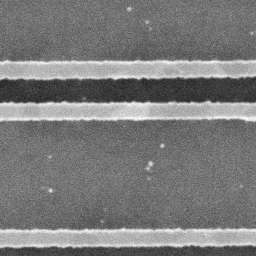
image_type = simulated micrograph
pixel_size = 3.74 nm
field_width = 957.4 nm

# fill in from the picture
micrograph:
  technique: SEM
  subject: lines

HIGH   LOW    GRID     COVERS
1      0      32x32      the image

00000000000000000000000000000000
00000000000000000000000000000000
00000000000000000000000000000000
00000000000000000000000000000000
00000000000000000000000000000000
00000000000000000000000000000000
00000000000000000000000000000000
00000000000000000000000000000000
11111111111111111111111111111111
11111111111111111111111111111111
00000000000000000000000000000000
00000000000000000000000000000000
00000000000000000000000000000000
11111111111111111111111111111111
11111111111111111111111111111111
00000000000000000000000000000000
00000000000000000000000000000000
00000000000000000000000000000000
00000000000000000000000000000000
00000000000000000000000000000000
00000000000000000000000000000000
00000000000000000000000000000000
00000000000000000000000000000000
00000000000000000000000000000000
00000000000000000000000000000000
00000000000000000000000000000000
00000000000000000000000000000000
00000000000000000000000000000000
00000000000000000000000000000000
11111111111111111111111111111111
11111111111111111111111111111111
00000000000000000000000000000000